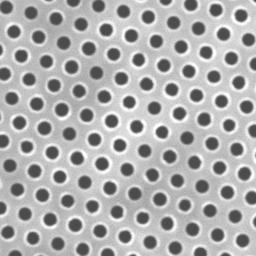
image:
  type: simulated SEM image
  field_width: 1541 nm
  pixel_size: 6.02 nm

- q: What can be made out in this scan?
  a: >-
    a regular array of holes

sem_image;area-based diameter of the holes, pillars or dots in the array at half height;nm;79.3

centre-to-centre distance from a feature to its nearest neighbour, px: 25.2